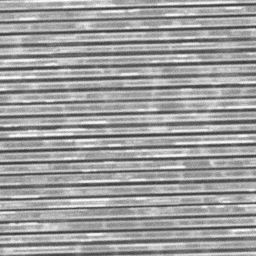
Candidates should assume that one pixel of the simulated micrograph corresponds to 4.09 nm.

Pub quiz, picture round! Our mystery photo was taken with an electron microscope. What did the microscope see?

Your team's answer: parallel lines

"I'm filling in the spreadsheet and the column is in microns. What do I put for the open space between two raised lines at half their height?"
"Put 0.0174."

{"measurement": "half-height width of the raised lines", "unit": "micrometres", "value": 0.0306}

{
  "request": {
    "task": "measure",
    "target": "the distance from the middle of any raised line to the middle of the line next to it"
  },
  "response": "47.9 nm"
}